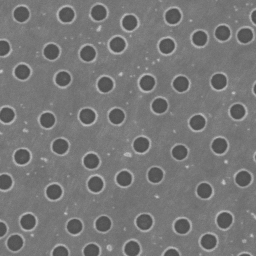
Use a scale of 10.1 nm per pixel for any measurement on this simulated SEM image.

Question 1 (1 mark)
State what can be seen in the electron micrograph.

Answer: a regular array of holes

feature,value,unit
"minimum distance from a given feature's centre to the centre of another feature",300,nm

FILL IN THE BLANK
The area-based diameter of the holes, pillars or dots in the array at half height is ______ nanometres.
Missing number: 167